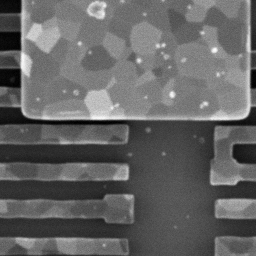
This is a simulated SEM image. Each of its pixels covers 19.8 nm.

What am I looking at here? wiring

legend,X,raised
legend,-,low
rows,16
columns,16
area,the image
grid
-XXXXXXXXXXXXXXX
-XXXXXXXXXXXXXXX
-XXXXXXXXXXXXXXX
-XXXXXXXXXXXXXXX
-XXXXXXXXXXXXXXX
-XXXXXXXXXXXXXXX
-XXXXXXXXXXXXXXX
----------------
----------------
----------------
----------------
----------------
----------------
----------------
----------------
----------------